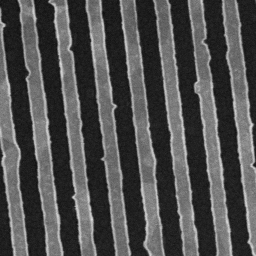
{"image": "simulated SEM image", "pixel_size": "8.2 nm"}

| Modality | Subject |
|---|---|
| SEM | parallel lines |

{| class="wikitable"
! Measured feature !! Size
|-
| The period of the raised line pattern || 276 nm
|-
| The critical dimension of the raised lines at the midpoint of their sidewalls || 113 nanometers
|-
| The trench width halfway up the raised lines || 165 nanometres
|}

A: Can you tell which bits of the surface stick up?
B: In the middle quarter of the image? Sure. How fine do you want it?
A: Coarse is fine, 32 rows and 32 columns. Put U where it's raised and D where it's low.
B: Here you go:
UUDDDDDDUUUDDDDDUUUDDDDDDUUUDDDD
UUDDDDDDUUUDDDDDUUUUDDDDDUUUDDDD
UUDDDDDDUUUDDDDDUUUUDDDDDUUUDDDD
UUUDDDDDUUUDDDDDUUUUDDDDDUUUDDDD
UUUDDDDDUUUDDDDDDUUUDDDDDUUUDDDD
UUUDDDDDUUUUDDDDDUUUDDDDDUUUDDDD
UUUDDDDDUUUUDDDDDUUUDDDDDUUUUDDD
UUUDDDDDUUUUDDDDDUUUDDDDDUUUUDDD
UUUDDDDDDUUUDDDDDUUUDDDDDDUUUDDD
UUUUDDDDDUUUDDDDDUUUDDDDDDUUUDDD
UUUUDDDDDUUUUDDDDUUUUDDDDDUUUDDD
UUUUDDDDDUUUDDDDDUUUUDDDDDUUUDDD
UUUUDDDDDUUUDDDDDDUUUDDDDDUUUDDD
DUUUDDDDDUUUDDDDDUUUUDDDDDUUUDDD
DUUUDDDDDUUUUDDDDDUUUDDDDDUUUUDD
DUUUDDDDDUUUUDDDDDUUUDDDDDUUUUDD
DUUUDDDDDUUUUDDDDDUUUDDDDDDUUUDD
DUUUDDDDDDUUUDDDDDUUUDDDDDDUUUDD
DUUUDDDDDDUUUDDDDDUUUDDDDDDUUUDD
DDUUUDDDDDUUUDDDDDUUUUDDDDDUUUDD
DDUUUDDDDDUUUDDDDDUUUUDDDDDUUUDD
DDUUUDDDDDUUUDDDDDDUUUDDDDDUUUDD
DDUUUDDDDDUUUDDDDDDUUUDDDDDUUUDD
DDUUUDDDDDUUUUDDDDDUUUDDDDDUUUDD
DDUUUDDDDDUUUUDDDDDUUUUDDDDUUUDD
DDUUUDDDDDDUUUDDDDDUUUUDDDDUUUUD
DDUUUDDDDDDUUUDDDDDUUUUDDDDUUUUD
DDUUUDDDDDDUUUDDDDDUUUDDDDDDUUUD
DDUUUUDDDDDUUUDDDDDUUUUDDDDDUUUD
DDUUUUDDDDDUUUDDDDDUUUUDDDDDUUUD
DDDUUUDDDDDUUUDDDDDUUUUDDDDDUUUD
DDDUUUDDDDDUUUDDDDDDUUUDDDDDUUUU